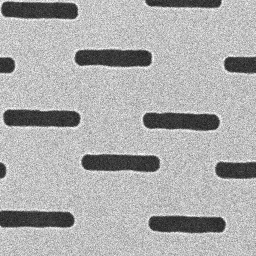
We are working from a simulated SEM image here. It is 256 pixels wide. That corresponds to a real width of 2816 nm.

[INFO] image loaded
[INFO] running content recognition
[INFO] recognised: holes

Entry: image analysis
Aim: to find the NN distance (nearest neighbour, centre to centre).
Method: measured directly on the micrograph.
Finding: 967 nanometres